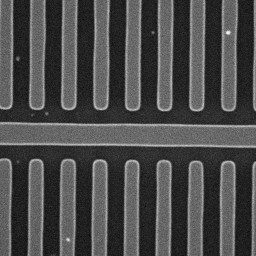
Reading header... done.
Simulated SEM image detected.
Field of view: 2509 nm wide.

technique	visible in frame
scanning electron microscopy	groups of lines, slits or small figures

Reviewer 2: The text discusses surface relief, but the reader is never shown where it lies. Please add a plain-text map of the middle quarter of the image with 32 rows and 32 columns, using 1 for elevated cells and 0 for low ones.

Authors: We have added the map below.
11100000111000011110000011100000
11100000111000011110000011100000
11100000111000011110000011100000
11100000111000011110000011100000
11100000111000011110000111100000
11100000111000011110000111100000
11100000111000011110000111100000
11100000111000011110000111100000
11100000111000011110000111100000
11100000111000011110000111100000
11100000111000011110000111100000
00000000000000001100000011000000
00000000000000000000000000000000
00000000000000000000000000000000
00000000000000000000000000000000
11111111111111111111111111111111
11111111111111111111111111111111
11111111111111111111111111111111
11111111111111111111111111111111
11111111111111111111111111111111
00000000000000000000000000000000
00000000000000000000000000000000
00000000000000000000000000000000
00000000000000000000000000000000
11100000110000001100000011000000
11100001111000011110000111100001
11100001111000011110000111100001
11100001111000011110000111100001
11100001111000011110000111100001
11100001111000011110000111100001
11100001111000011110000111100001
11100001111000011110000111100001